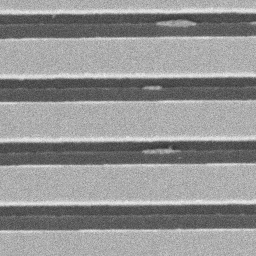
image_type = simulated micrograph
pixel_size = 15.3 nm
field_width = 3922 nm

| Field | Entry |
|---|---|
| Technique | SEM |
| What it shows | lines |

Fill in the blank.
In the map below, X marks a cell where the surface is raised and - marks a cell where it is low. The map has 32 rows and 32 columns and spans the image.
XXXXXXXXXXXXXXXXXXXXXXXXXXXXXXXX
XXXXXXXXXXXXXXXXXXXXXXXXXXXX--XX
--------------------------------
--------------------------------
--------------------------------
XXXXXXXXXXXXXXXXXXXXXXXXXXXXXXXX
XXXXXXXXXXXXXXXXXXXXXXXXXXXXXXXX
XXXXXXXXXXXXXXXXXXXXXXXXXXXXXXXX
XXXXXXXXXXXXXXXXXXXXXXXXXXXXXXXX
XXXXXXXXXXXXXXXXXXXXXXXXXXXXXXXX
--------------------------------
--------------------------------
--------------------------------
XXXXXXXXXXXXXXXXXXXXXXXXXXXXXXXX
XXXXXXXXXXXXXXXXXXXXXXXXXXXXXXXX
XXXXXXXXXXXXXXXXXXXXXXXXXXXXXXXX
XXXXXXXXXXXXXXXXXXXXXXXXXXXXXXXX
XXXXXXXXXXXXXXXXXXXXXXXXXXXXXXXX
--------------------------------
--------------------------------
--------------------------------
XXXXXXXXXXXXXXXXXXXXXXXXXXXXXXXX
XXXXXXXXXXXXXXXXXXXXXXXXXXXXXXXX
XXXXXXXXXXXXXXXXXXXXXXXXXXXXXXXX
XXXXXXXXXXXXXXXXXXXXXXXXXXXXXXXX
XXXXXXXXXXXXXXXXXXXXXXXXXXXXX-XX
--------------------------------
--------------------------------
--------------------------------
XXXXXXXXXXXXXXXXXXXXXXXXXXXXXXXX
XXXXXXXXXXXXXXXXXXXXXXXXXXXXXXXX
XXXXXXXXXXXXXXXXXXXXXXXXXXXXXXXX